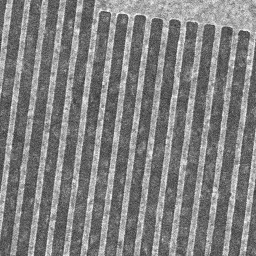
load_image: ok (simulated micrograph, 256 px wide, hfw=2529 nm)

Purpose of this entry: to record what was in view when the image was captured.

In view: parallel lines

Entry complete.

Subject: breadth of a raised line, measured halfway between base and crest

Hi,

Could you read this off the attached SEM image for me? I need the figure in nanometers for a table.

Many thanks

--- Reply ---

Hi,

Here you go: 50.2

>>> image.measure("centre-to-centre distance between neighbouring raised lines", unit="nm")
173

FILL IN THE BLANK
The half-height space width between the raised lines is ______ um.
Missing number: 0.124